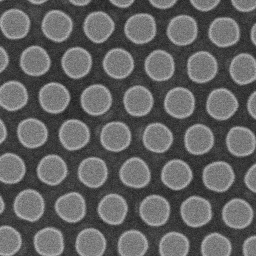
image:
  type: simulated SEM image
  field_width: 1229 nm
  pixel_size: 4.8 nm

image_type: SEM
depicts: an array of small figures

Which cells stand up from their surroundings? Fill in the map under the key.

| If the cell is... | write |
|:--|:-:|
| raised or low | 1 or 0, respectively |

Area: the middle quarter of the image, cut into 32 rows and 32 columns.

11111110001111111000111111100001
11111100001111111000011111100001
01111100000111110000011111100001
00000000000001100000001111000000
00000000000000000000000000000000
00000001110000000000000000000000
10000111111000001111100000011110
10000111111000011111110000111111
10001111111100011111110001111111
10001111111100011111110001111111
10000111111000011111110001111111
00000111111000001111100000111111
00000011100000000111000000011111
00000000000000000000000000000000
01110000000000000000000000000000
11111000001111100000011110000000
11111100001111110000111111000001
11111100011111111000111111100001
11111100011111111000111111100011
11111100011111110000111111100011
11111000001111110000111111000011
00000000000111000000011110000001
00000000000000000000000000000000
00000010000000000000000000000000
00000111110000001111000000111100
00001111110000011111100001111110
10001111111000111111100001111110
00001111111000111111100001111111
00001111110000111111100001111111
00000111110000011111100001111110
00000011100000001111000000111100
00000000000000000000000000000000